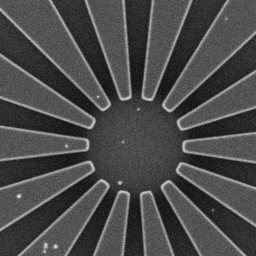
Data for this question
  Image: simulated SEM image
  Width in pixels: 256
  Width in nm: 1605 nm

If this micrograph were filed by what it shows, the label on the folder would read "groups of lines, slits or small figures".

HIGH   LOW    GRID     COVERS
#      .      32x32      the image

#######....#####...#####....####
#######....#####...####....#####
.#######....####...####....#####
..######....####...####...######
...######...####...###....######
....######...###..####...######.
.....#####...###..###...#####...
#.....#####..###..###...####....
###....####...##..###..####.....
####....####..##..##...###.....#
######...###..##..##..###....###
#######...###..#..##.###....####
.#######...###.......##...######
....######..#........#...#######
.......####............######...
.........###..........###.......
#####...........................
###########.............########
###########............#########
#####.....................######
..........#.....................
.......####...........####......
...#######.............######...
########...##.......##...#######
#######...###..#..#..##...######
#####....###..##..#..###....####
####....####..##..##..###....###
##.....####..###..##..####.....#
#.....####...###..###..####.....
.....#####...###..###...####....
....#####...####..###...#####...
...######...###...####...#####..